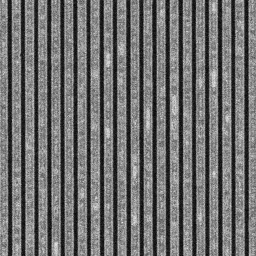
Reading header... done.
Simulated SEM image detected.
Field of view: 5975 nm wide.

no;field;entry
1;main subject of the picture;parallel lines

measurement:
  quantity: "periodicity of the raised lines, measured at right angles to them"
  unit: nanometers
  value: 307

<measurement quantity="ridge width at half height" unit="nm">178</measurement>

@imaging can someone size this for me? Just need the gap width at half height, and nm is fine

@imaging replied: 134